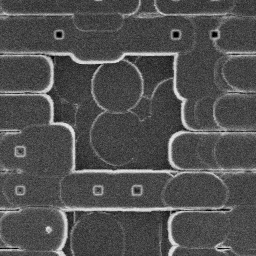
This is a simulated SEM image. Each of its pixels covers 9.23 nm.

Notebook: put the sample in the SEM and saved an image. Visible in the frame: wiring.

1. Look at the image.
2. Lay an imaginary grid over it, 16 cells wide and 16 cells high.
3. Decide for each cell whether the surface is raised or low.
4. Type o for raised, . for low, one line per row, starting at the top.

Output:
oooooooooooooooo
oooooooooooooooo
oooooooooooooooo
ooo.oooo...ooooo
ooo........ooooo
ooo........ooooo
ooo........ooooo
ooo........ooooo
ooooo......ooooo
ooooo......ooooo
ooooo......ooooo
oooooooooooooooo
oooooooooooooooo
oooo.......ooooo
oooo.......ooooo
oooo.......ooooo